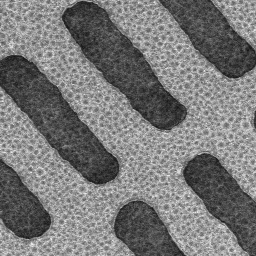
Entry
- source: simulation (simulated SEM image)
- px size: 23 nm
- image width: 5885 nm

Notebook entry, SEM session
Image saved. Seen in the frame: holes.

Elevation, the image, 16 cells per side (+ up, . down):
++++..++++....++
++++...++++...++
+++++...++++...+
+++++....++++...
...+++....++++..
....+++...++++++
+...++++...+++++
++...++++..+++++
+++...++++++++++
++++...+++++++++
.++++..+++++..++
..++++++++++...+
..+++++++++++...
...++++...+++...
+..++++....+++..
++++++++...++++.